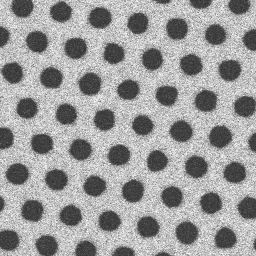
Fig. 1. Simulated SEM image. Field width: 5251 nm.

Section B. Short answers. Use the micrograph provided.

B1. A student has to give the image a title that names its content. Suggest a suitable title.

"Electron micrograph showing a regular array of holes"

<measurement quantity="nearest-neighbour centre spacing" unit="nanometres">786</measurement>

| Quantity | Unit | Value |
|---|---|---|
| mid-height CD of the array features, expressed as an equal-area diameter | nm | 451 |